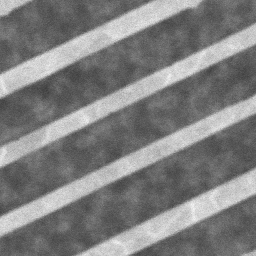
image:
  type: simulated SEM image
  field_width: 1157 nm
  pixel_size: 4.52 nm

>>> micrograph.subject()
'one or a few lines or trenches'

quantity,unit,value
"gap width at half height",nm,210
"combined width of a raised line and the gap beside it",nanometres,292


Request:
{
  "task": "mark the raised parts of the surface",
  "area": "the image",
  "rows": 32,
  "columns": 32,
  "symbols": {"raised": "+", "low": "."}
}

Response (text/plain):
+++...............+++++++.......
+...............++++++..........
..............++++++............
............++++++.............+
..........++++++.............+++
........++++++.............+++++
......++++++.............+++++..
....++++++.............+++++....
..++++++.............++++.......
++++++.............++++.........
+++..............++++...........
+..............++++.............
.............++++..............+
..........+++++..............+++
........+++++.............+++++.
......+++++.............+++++...
....+++++.............+++++.....
..+++++.............+++++.......
+++++.............+++++.........
+++.............+++++...........
+.............+++++.............
............++++...............+
..........++++...............+++
........++++...............+++++
......++++...............++++++.
....++++...............++++++...
.+++++...............++++++.....
++++...............++++++.......
++...............++++++.........
...............++++++...........
.............++++++.............
..........+++++++...............